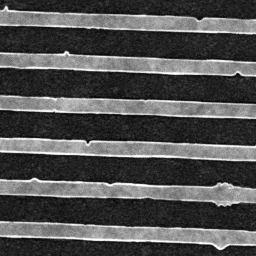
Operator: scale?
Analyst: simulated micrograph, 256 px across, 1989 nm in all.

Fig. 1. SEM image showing parallel lines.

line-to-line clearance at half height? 219 nm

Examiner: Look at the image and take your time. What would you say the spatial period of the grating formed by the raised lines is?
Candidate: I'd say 328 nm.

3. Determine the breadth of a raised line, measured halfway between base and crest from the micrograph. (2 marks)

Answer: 107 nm